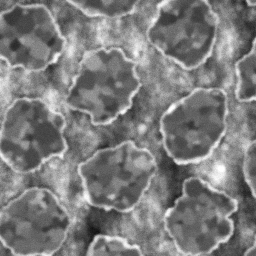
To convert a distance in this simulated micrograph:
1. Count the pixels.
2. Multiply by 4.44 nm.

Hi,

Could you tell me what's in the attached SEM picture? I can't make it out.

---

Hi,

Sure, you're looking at raised bodies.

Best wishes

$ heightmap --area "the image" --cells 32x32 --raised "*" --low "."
.........********...******.....*
.*****....******....*******.....
*******............********.....
*******............********.....
********..........*********.....
********...........********.....
********...****.....******.....*
.******...******......****....**
...***....*******......*......**
..........*******.............**
.........********.............**
.........********.......****..**
..***...********.......*****..*.
.*****...*******.....*******....
.*******...****.....********....
********....*.......********....
********............********....
********............*******.....
********......***....******....*
*******.....*******..*****.....*
.****.....**********..........**
..**......*********...........**
..........*********....**......*
....*......*******.....****....*
...****....*******.....******...
.******....******.....********..
********.............********...
*********...........*********...
*********............********...
********.............********...
.*******....****......*****.....
..*****....*******.....***.....*